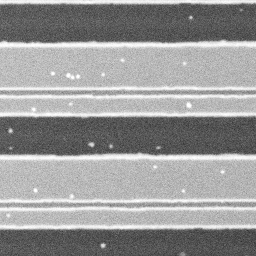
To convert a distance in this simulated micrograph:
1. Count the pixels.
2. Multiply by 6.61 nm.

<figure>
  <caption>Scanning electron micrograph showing lines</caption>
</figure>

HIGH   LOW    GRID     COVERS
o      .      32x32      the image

................................
................................
................................
................................
................................
ooooo..ooooooooooooo..oooooooooo
oooooooooooooooooooooooooooooooo
oooooooooooooooooooooooooooooooo
oooooooooooooooooooooooooooooooo
oooooooooooooooooooooooooooooooo
oooooooooooooooooooooooooooooooo
oooooooooooooooooooooooooooooooo
oooooooooooooooooooooooooooooooo
oooooooooooooooooooooooooooooooo
................................
................................
................................
................................
................................
.................o..............
oooooooooooooooooooooooooooooooo
oooooooooooooooooooooooooooooooo
oooooooooooooooooooooooooooooooo
oooooooooooooooooooooooooooooooo
oooooooooooooooooooooooooooooooo
oooooooooooooooooooooooooooooooo
oooooooooooooooooooooooooooooooo
oooooooooooooooooooooooooooooooo
................................
................................
................................
................................